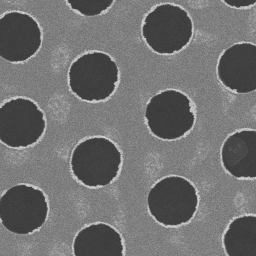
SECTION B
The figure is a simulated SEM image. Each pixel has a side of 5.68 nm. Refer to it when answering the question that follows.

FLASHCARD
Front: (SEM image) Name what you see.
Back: holes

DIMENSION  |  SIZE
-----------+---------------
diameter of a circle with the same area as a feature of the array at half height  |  274 nm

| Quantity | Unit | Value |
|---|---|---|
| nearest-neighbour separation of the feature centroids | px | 85.2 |